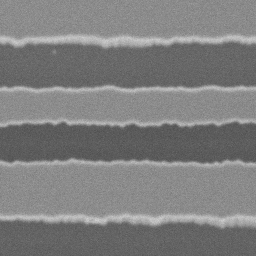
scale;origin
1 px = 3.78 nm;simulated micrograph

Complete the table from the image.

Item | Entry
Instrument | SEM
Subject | lines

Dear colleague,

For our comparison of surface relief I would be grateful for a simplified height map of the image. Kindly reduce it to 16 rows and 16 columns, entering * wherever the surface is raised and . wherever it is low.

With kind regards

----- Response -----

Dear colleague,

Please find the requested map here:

****************
****************
***...*****..*.*
................
................
**.*..**.*******
****************
****************
................
................
****************
****************
****************
****************
................
................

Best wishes